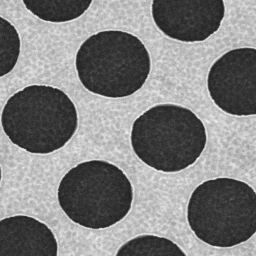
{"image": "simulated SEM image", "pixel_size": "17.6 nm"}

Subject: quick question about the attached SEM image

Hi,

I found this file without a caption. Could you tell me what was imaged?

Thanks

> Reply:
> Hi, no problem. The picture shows holes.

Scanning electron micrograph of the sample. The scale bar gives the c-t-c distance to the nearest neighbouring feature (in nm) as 1620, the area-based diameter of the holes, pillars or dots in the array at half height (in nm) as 1250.